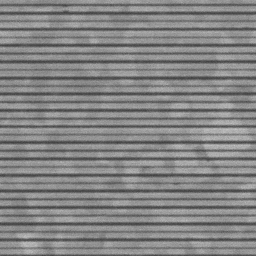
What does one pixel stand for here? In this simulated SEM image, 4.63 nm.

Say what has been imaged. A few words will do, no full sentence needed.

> parallel lines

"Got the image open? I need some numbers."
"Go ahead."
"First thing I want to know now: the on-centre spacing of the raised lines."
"37.5 nanometres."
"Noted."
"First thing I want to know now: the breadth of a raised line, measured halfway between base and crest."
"0.0232 um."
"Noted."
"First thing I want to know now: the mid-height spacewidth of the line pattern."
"11.6 nm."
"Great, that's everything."